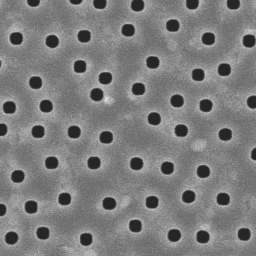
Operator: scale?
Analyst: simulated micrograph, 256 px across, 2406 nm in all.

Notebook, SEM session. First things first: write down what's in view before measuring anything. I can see a regular array of holes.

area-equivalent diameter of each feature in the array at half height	130	nanometres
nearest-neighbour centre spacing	29.1	pixels